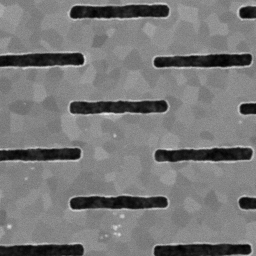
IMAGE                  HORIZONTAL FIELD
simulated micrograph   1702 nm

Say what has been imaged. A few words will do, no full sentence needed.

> holes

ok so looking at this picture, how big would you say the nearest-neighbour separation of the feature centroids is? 636 nanometers